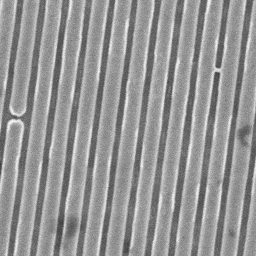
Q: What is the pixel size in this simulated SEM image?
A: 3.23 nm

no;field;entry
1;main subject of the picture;parallel lines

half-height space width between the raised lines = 0.0224 micrometres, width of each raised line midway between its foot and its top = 53.3 nanometers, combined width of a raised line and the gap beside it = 73.6 nanometers